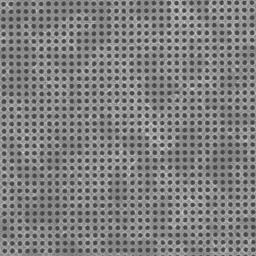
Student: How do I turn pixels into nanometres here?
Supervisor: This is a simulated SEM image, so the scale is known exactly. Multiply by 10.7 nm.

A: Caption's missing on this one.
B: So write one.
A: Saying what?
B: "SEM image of a regular array of holes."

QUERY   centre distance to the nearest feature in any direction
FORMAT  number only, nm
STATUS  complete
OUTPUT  77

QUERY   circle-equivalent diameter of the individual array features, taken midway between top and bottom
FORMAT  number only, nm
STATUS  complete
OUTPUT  52.6